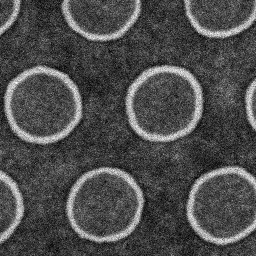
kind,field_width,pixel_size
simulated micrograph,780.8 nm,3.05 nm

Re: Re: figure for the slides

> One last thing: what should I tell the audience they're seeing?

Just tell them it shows raised bodies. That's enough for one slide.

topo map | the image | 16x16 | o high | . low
o...ooooo...oooo
o....ooo....ooo.
................
................
..o......oo.....
.oooo...oooo....
ooooo...oooo....
.oooo...oooo....
..oo.....oo.....
................
................
o....ooo....oooo
o...ooooo...oooo
o...ooooo...oooo
o....ooo.....oo.
................